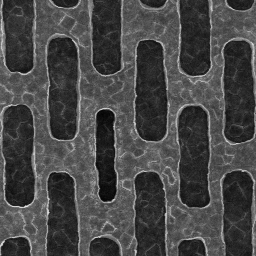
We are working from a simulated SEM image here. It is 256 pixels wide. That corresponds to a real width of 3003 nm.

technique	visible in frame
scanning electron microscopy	holes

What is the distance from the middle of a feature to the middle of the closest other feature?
912 nanometers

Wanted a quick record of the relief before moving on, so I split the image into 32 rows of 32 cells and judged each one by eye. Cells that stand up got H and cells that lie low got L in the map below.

LLLLHHHLLLHHLLLHHHLLLHLLLLHHHLLL
LLLLHHHHHHHHLLLHHHHHHHLLLLHHHHHH
LLLLHHHHHHHLLLLHHHHHHHLLLLHHHHHH
LLLLHHHHHHHLLLLHHHHHHHHLLLHHHHHH
HLLLHHHHHHHLLLLHHHHHHHHLLLHHHHHH
LLLLHHLLLHHLLLLHHLLLHHHLLLHHLLLH
HLLLHHLLLLHLLLLHHLLLHHHLLLHHLLLL
HLLLHHLLLLHHLLLHHLLLLHLLLLHHLLLL
HLLLHHLLLLHHLLLHHLLLLHHLLLHHLLLL
HHHHHHLLLLHHHHHHHLLLLHHHHHHHLLLL
HHHHHHLLLLHHHHHHHLLLLHHHHHHHLLLL
HHHHHHLLLLHHHHHHHLLLLHHHHHHHLLLL
HHHHHHLLLLHHHHHHHLLLLHHHHHHHLLLL
HLLLHHLLLLHHHHHHHLLLLHHLLHHHLLLL
LLLLHHLLLLHHLLHHHLLLLHLLLLHHLLLL
LLLLHHLLLLHHLLHHHLLLLHLLLLHHLLLL
LLLLHHLLLLHHLLHHHLLLLHLLLLHHLLLL
LLLLHHHHHHHHLLHHHHLLHHLLLLHHLLLH
LLLLHHHHHHHHLLHHHHHHHHHLLLHHHHHH
LLLLHHHHHHHHLLHHHHHHHHHLLLHHHHHH
HLLLHHHHHHHHLLHHHHHHHHLLLLHHHHHH
HLLLHHHHHHHHLLHHHHLHHHLLLLHHHLLH
HLLLHHLLLHHHLLLHHLLLHHLLLLHHLLLL
HLLLHHLLLHHHLLLHHLLLHHLLLLHHLLLL
HLLLHHLLLHHHLLHHHLLLLHHLLLHHLLLL
HLLLHHLLLHHHHHHHHLLLLHHLLLHHLLLL
HHHHHHLLLLHHHHHHHLLLLHHHHHHHLLLL
HHHHHHLLLLHHHHHHHLLLLHHHHHHHLLLL
HHHHHHLLLLHHHHHHHLLLLHHHHHHHLLLL
HHHHHHLLLLHHHHHHHLLLLHHHHHHHLLLH
LLLLHHLLLLHLLLLHHLLLLHLLLHHHLLLH
LLLLHHLLLLHLLLLHHLLLLHLLLLHHLLLL